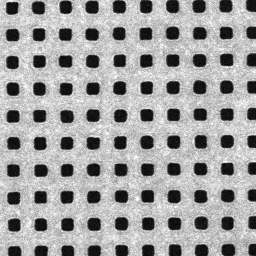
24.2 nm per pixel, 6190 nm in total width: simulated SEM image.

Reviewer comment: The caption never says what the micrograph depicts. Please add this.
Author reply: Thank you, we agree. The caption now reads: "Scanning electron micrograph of a regular array of holes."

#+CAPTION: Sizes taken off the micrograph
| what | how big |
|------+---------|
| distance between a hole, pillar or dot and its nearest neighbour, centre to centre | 641 nanometres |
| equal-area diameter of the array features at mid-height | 352 nm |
